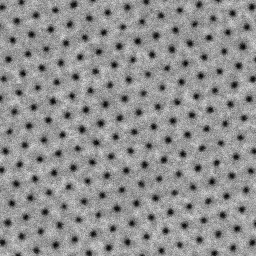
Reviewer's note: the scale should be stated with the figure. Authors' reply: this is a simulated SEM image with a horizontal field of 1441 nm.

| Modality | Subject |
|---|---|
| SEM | a regular array of holes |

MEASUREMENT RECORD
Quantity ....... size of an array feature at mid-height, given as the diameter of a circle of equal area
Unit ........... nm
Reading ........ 37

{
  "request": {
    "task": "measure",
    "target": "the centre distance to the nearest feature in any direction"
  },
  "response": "109 nm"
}